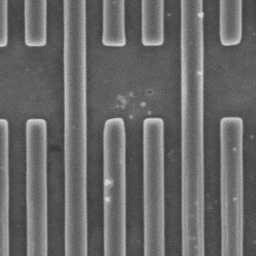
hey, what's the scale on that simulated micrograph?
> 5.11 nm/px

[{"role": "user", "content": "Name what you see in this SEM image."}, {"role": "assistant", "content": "wiring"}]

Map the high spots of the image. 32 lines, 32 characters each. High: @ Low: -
@--@@@--@@@--@@---@@---@@---@@--
@--@@@--@@@--@@---@@---@@---@@--
@--@@@--@@@--@@---@@---@@---@@--
@--@@@--@@@--@@---@@---@@---@@--
@--@@@--@@@--@@@--@@---@@---@@--
@--@@---@@@--@@---@@---@@---@---
--------@@@------------@@-------
--------@@@------------@@-------
--------@@@------------@@-------
--------@@@------------@@-------
--------@@@------------@@-------
--------@@@------------@@-------
--------@@@------------@@-------
--------@@@------------@@-------
--------@@@------------@@-------
@--@@@--@@@--@@---@@---@@---@@--
@--@@@--@@@--@@@--@@---@@---@@--
@--@@@--@@@--@@@--@@---@@---@@--
@--@@@--@@@--@@@--@@---@@---@@--
@--@@@--@@@--@@@--@@---@@---@@--
@--@@@--@@@--@@@--@@---@@---@@--
@--@@@--@@@--@@@--@@---@@---@@--
@--@@@--@@@--@@@--@@---@@---@@--
@--@@@--@@@--@@@--@@---@@---@@--
@--@@@--@@@--@@@--@@---@@---@@--
@--@@@--@@@--@@@--@@---@@---@@--
@--@@@--@@@--@@@--@@---@@---@@--
@--@@@--@@@--@@@--@@---@@---@@--
@--@@@--@@@--@@@--@@---@@---@@--
@--@@@--@@@--@@@--@@---@@---@@--
@--@@@--@@@--@@@--@@---@@---@@--
@--@@@--@@@--@@@--@@---@@---@@--